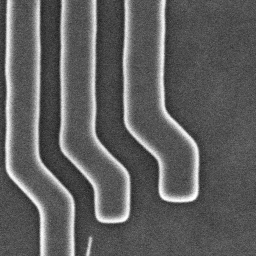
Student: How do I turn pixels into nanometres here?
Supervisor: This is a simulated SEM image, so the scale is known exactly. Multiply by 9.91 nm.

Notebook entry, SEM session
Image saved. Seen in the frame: groups of lines, slits or small figures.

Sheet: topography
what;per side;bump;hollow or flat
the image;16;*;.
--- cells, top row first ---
**..**..**......
**..**..**......
**..**..**......
**..**..**......
**..**..**......
**..**..**......
**..**..**......
**..**..***.....
**..**..****....
**..***..***....
***..***..**....
.***..**..**....
..**..**...*....
...**.**........
...**...........
...**...........